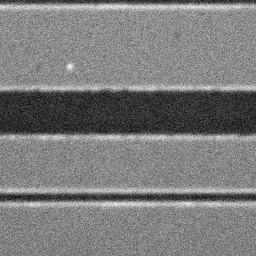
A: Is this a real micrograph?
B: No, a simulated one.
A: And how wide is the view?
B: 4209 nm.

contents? lines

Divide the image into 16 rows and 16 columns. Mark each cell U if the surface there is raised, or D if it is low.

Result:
UUUUUUUUUUUUUUUU
UUUUUUUUUUUUUUUU
UUUUUUUUUUUUUUUU
UUUUUUUUUUUUUUUU
UUUUUUUUUUUUUUUU
UUUUUUUUUUUUUUUU
DDDDDDDDDDDDDDDD
DDDDDDDDDDDDDDDD
DDDDDDDDDDDDDDDD
UUUUUUUUUUUUUUUU
UUUUUUUUUUUUUUUU
UUUUUUUUUUUUUUUU
UUUUUUUUUUUUUUUU
UUUUUUUUUUUUUUUU
UUUUUUUUUUUUUUUU
UUUUUUUUUUUUUUUU